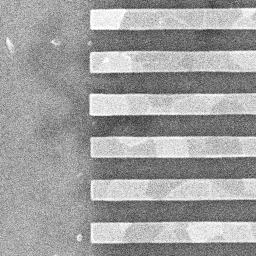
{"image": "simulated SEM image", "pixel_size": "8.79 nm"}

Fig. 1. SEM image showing wiring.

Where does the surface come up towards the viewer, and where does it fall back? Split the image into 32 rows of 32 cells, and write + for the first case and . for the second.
................................
............++++++++++++++++++++
...........+++++++++++++++++++++
............++++++++++++++++++++
................................
................................
.............................+++
...........+++++++++++++++++++++
...........+++++++++++++++++++++
................................
................................
................................
...........+++++++++++++++++++++
...........+++++++++++++++++++++
................................
................................
................................
............++++++++++++++++++++
............++++++++++++++++++++
............++++++++++++++++++..
................................
................................
...................+++++++++++++
............++++++++++++++++++++
............++++++++++++++++++++
................................
................................
................................
............++++++++++++++++++++
............++++++++++++++++++++
................................
................................